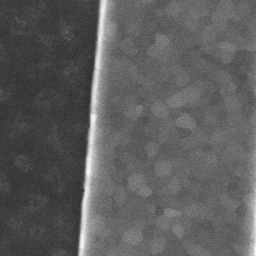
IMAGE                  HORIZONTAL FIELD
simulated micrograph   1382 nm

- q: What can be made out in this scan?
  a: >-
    one or a few lines or trenches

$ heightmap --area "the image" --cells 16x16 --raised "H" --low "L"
LLLLLLHHHHHHHHHH
LLLLLLHHHHHHHHHH
LLLLLLHHHHHHHHHH
LLLLLLHHHHHHHHHH
LLLLLLHHHHHHHHHH
LLLLLLHHHHHHHHHH
LLLLLLHHHHHHHHHH
LLLLLLHHHHHHHHHH
LLLLLLHHHHHHHHHH
LLLLLLHHHHHHHHHH
LLLLLHHHHHHHHHHH
LLLLLHHHHHHHHHHH
LLLLLHHHHHHHHHHH
LLLLLHHHHHHHHHHH
LLLLLHHHHHHHHHHH
LLLLLHHHHHHHHHHH